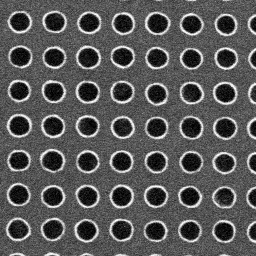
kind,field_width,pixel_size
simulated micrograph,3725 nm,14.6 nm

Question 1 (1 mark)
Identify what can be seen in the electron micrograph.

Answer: a regular array of raised bodies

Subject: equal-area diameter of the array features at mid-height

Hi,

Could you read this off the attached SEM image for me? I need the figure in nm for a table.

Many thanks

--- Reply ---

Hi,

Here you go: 314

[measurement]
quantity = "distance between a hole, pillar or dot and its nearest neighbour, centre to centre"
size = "493 nanometres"